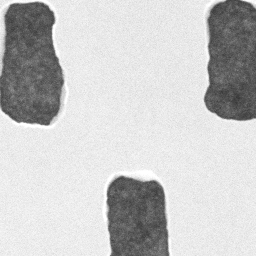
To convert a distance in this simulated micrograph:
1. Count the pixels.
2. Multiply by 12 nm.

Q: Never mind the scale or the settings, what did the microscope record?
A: holes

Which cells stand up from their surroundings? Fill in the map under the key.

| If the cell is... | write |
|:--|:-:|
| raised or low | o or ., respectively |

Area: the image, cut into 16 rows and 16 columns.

...oooooooooo...
...oooooooooo...
...oooooooooo...
....ooooooooo...
....ooooooooo...
....ooooooooo...
....ooooooooo...
o...ooooooooooo.
oooooooooooooooo
oooooooooooooooo
oooooooooooooooo
ooooooo...oooooo
ooooooo...oooooo
ooooooo...oooooo
ooooooo...oooooo
ooooooo....ooooo